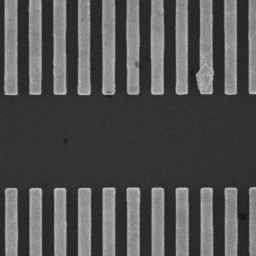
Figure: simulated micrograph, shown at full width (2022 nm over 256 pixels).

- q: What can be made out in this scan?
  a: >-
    wiring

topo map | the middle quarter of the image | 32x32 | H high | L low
LLLLHHLLLLHHHLLLHHHLLLHHHLLLHHHL
LLLLHHLLLLHHHLLLHHHLLLHHHLLLHHHL
LLLLHHLLLLHHHLLLHHHLLLHHHLLLHHHL
LLLLHHLLLLHHHLLLHHHLLLHHHLLLHHHL
LLLLHHLLLLHHHLLLHHHLLLHHHLLLHHHL
HLLLHHLLLLHHHLLLHHHLLLHHHLLLHHHL
HLLLHHLLLLHHHLLLHHHLLLHHHLLLHHHL
LLLLHHLLLLLLLLLLLLLLLLLLLLLLLLLL
LLLLLLLLLLLLLLLLLLLLLLLLLLLLLLLL
LLLLLLLLLLLLLLLLLLLLLLLLLLLLLLLL
LLLLLLLLLLLLLLLLLLLLLLLLLLLLLLLL
LLLLLLLLLLLLLLLLLLLLLLLLLLLLLLLL
LLLLLLLLLLLLLLLLLLLLLLLLLLLLLLLL
LLLLLLLLLLLLLLLLLLLLLLLLLLLLLLLL
LLLLLLLLLLLLLLLLLLLLLLLLLLLLLLLL
LLLLLLLLLLLLLLLLLLLLLLLLLLLLLLLL
LLLLLLLLLLLLLLLLLLLLLLLLLLLLLLLL
LLLLLLLLLLLLLLLLLLLLLLLLLLLLLLLL
LLLLLLLLLLLLLLLLLLLLLLLLLLLLLLLL
LLLLLLLLLLLLLLLLLLLLLLLLLLLLLLLL
LLLLLLLLLLLLLLLLLLLLLLLLLLLLLLLL
LLLLLLLLLLLLLLLLLLLLLLLLLLLLLLLL
LLLLLLLLLLLLLLLLLLLLLLLLLLLLLLLL
LLLLLLLLLLLLLLLLLLLLLLLLLLLLLLLL
LLLLLLLLLLLLLLLLLLLLLLLLLLLLLLLL
LLLLLLLLLLLLLLLLLLLLLLLLLLLLLLLL
LLLLLLLLLLLLLLLLLLLLLLLLLLLLLLLL
LLLLLLLLLLLLLLLLLLLLLLLLLLLLLLLL
LLLLLLLLLLLLLLLLLLLLLLLLLLLLLLLL
LLLLLLLLLLLLLLLLLLLLLLLLLLLLLLLL
LLLLLLLLLLLLLLLLLLLLLLLLLLLLLLLL
LLLLHHHLLLHHHLLLHHHLLLHHHLLLHHHL